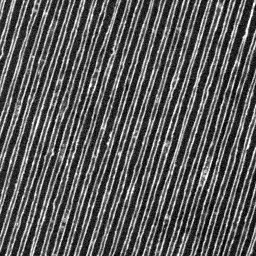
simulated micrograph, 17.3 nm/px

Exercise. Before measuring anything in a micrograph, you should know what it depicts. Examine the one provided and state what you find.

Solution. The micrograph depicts parallel lines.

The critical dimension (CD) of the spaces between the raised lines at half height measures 106 nm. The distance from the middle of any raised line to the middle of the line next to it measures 190 nanometres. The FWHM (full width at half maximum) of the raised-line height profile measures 74.8 nanometres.